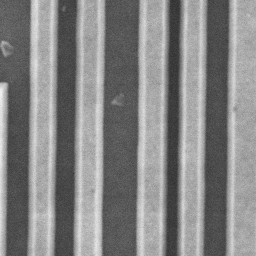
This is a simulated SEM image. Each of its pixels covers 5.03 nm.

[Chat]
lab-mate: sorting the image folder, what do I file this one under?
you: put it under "groups of lines, slits or small figures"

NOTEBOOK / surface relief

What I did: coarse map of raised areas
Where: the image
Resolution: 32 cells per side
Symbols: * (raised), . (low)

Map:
....***...***.....***..***...***
....***...***.....***..**....***
....***...***.....***..**....***
....***...***.....***..**....***
....***...***.....***..**....***
....***...***.....***..**....***
....***...***.....***..**....***
....***...***.....***..**....***
....***...***.....***..**....***
....***...***.....***..**....***
....***...***.....***..**....***
*...***...***.....***..**....***
*...***...***.....***..**....***
*...***...***.....***..**....***
*...***...***.....***..**....***
*...***...**......***..**....***
*...***...**......***..**....***
*...***...***.....***..**....***
....***...***.....***..**....***
....***...***.....***..**....***
....***...***.....***..**....***
....***...***.....***..**....***
....***...***.....***..**....***
....***...**......***..**....***
....**....**.....****..**....***
....**....**.....****..**....***
....**....**.....***...**....***
....***...**.....***...**....***
....**....**.....***...**....***
....**....**.....***...**....***
....**....**.....***...**....***
....**....**.....***...**....***